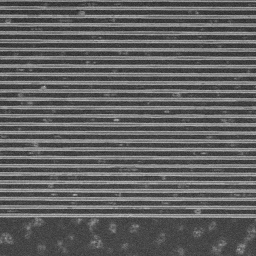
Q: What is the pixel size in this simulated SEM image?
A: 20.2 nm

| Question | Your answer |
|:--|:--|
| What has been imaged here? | parallel lines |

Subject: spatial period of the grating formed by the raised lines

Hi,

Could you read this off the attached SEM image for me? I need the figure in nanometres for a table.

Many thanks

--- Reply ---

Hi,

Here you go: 167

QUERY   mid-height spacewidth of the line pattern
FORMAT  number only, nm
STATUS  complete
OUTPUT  134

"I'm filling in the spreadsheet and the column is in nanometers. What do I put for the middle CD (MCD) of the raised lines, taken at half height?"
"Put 32.8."